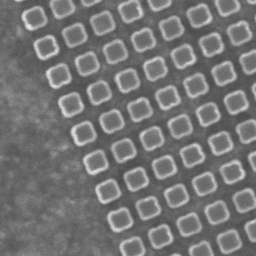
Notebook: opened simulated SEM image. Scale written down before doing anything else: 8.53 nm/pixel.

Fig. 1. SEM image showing a regular array of raised bodies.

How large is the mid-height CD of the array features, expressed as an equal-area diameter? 192 nm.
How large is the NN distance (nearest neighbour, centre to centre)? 0.259 µm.